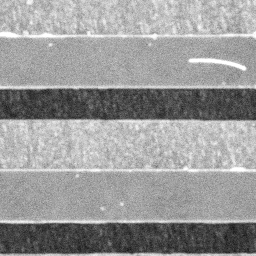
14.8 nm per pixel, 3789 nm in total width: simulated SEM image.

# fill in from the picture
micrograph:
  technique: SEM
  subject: lines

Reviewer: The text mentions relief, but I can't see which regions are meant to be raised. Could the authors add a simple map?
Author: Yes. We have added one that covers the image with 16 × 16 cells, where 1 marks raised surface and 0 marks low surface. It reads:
1111111111111111
1111111111111111
1111111111111111
1111111111111111
1111111111111111
0000000000000000
0000000000000000
0000000000000000
1111111111111111
1111111111111111
1111111111111111
1111111111111111
1111111111111111
1111111111111111
0000000000000000
0000000000000000